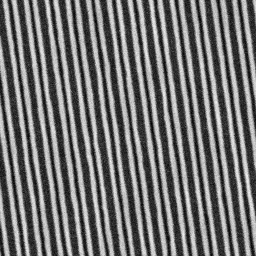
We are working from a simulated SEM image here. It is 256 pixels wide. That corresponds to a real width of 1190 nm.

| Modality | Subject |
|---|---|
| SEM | parallel lines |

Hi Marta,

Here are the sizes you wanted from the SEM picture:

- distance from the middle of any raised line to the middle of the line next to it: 48 nanometres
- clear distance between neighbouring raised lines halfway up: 0.0288 µm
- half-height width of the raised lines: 16.7 nm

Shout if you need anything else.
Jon